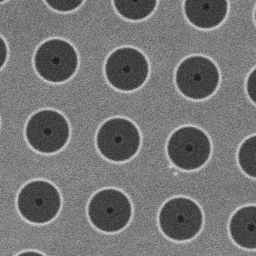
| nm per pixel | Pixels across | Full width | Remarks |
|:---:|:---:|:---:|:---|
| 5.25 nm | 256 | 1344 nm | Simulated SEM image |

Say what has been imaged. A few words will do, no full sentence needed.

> an array of small figures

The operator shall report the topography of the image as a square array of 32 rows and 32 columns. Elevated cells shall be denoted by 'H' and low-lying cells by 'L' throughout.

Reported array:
HHHHHHLLLLHHHHLLLLLLHHHLLHLLHHHH
HHHHHHHHHHHHHHHLLLLHHHHLLLLLHHHH
HHHHHHHHHHHHHHHHLHHHHHHHLLLLHHHH
HHHHHHHHHHHHHHHHHHHHHHHHHLLHHHHH
HHHHHHHHHHHHHHHHHHHHHHHHHHHHHHHH
LHHHHLLLLHHHHHHHHHHHHHHHHHHHHHHH
LHHHLLLLLHHHHHLLLLHHHHHHHHHHHHHH
LHHHLLHHLLHHHLLLLLHHHHHLLLHHHHHH
HHHHLLLLLLHHHLLHLLLHHHLLLLLHHHHH
HHHHHLLLLHHHHLLLLLHHHHLLHLLHHHHL
HHHHHHHHHHHHHHLLLLHHHHLLLLLHHHHL
HHHHHHHHHHHHHHHHHHHHHHHLLLLHHHHL
HHHHHHHHHHHHHHHHHHHHHHHHHHHHHHHL
HHHHHHHHHHHHHHHHHHHHHHHHHHHHHHHH
HHHHLLLLHHHHHHHHHHHHHHHHHHHHHHHH
HHHLLLLLLHHHHLLLLHHHHHHHHHHHHHHH
HHHLLHLLLHHHLLLLLHHHHHLLLHHHHHHH
HHHLLLLLHHHHLLHLLLHHHLLLLLHHHHHL
HHHHLLLLHHHHLLLLLHHHHLLHLLHHHHLL
HHHHHHHHHHHHHLLLLHHHHLLLLLHHHHLL
HHHHHHHHHHHHHHHHHHHHHHLLLLHHHHLL
HHHHHHHHHHHHHHHHHHHHHHHHHHHHHHHL
HHHHHHHHHHHHHHHHHHHHHHHHHHHHHHHH
HHHLLLLHHHHHHHHHHHHHHHHHHHHHHHHH
HHLLLLLLHHHHLLLLHHHHHHHHHHHHHHHH
HHLLHLLLHHHLLLLLHHHHHLLLLHHHHHHH
HHLLLLLHHHHLLHLLLHHHLLLLLHHHHLLL
HHHLLLHHHHHLLLLLHHHHLLHLLHHHHLLL
HHHHHHHHHHHHLLLHHHHHLLLLLHHHHLLH
HHHHHHHHHHHHHHHHHHHHHLLLHHHHHLLL
HHHHHHHHHHHHHHHHHHHHHHHHHHHHHHLL
HHHLLHHHHHHHHHHHHHHHHHHHHHHHHHHH